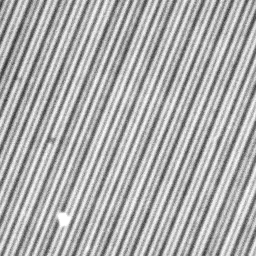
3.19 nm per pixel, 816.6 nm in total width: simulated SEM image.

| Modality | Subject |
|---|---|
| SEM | parallel lines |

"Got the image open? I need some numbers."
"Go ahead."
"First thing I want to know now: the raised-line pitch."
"0.0213 µm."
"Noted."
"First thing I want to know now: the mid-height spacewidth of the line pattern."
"0.0131 µm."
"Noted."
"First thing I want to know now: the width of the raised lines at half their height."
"2.7 pixels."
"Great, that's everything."